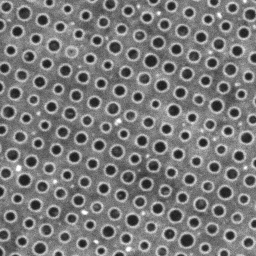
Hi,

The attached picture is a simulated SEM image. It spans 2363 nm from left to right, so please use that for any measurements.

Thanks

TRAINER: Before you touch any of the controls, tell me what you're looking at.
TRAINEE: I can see a regular array of raised bodies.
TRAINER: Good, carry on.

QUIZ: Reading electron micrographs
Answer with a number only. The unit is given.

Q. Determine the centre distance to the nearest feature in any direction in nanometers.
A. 176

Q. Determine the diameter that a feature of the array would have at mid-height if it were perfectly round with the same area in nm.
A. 111